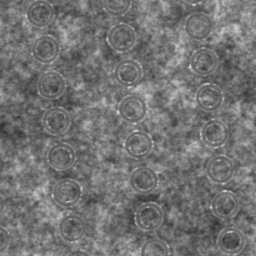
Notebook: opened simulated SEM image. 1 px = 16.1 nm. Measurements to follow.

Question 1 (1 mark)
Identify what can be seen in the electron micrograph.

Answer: a regular array of ring-shaped raised bodies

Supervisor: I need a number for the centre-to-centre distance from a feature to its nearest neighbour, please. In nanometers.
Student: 575